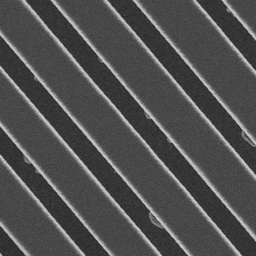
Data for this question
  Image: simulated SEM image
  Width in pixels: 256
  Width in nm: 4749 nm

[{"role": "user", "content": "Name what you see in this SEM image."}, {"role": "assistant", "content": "lines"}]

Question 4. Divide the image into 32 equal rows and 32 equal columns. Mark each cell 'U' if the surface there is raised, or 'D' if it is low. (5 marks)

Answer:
UUUDDDDUUUUUUUDDDUUUUUUUUDDDUUUU
UUUUDDDDUUUUUUUDDDUUUUUUUUDDDUUU
UUUUUDDDDUUUUUUDDDDUUUUUUUUDDDUU
UUUUUUDDDUUUUUUUDDDDUUUUUUUDDDDU
UUUUUUUDDDUUUUUUUDDDUUUUUUUUDDDD
DUUUUUUUDDDUUUUUUUDDDUUUUUUUUDDD
DDUUUUUUUDDDUUUUUUUDDDUUUUUUUUDD
DDDUUUUUUDDDDUUUUUUUDDDUUUUUUUUD
DDDDUUUUUUDDDDUUUUUUUDDDUUUUUUUU
UDDDUUUUUUUDDDUUUUUUUDDDDUUUUUUU
UUDDDUUUUUUUDDDUUUUUUUDDDDUUUUUU
UUUDDDUUUUUUUDDDUUUUUUUDDDUUUUUU
UUUUDDDUUUUUUUDDDUUUUUUUDDDUUUUU
UUUUDDDDUUUUUUUDDDUUUUUUUDDDUUUU
UUUUUDDDDUUUUUUDDDDUUUUUUUDDDUUU
UUUUUUDDDUUUUUUUDDDDUUUUUUDDDDUU
DUUUUUUDDDUUUUUUUDDDUUUUUUUDDDDU
DUUUUUUUDDDUUUUUUUDDDUUUUUUUDDDU
DDUUUUUUUDDDUUUUUUUDDDUUUUUUUDDD
DDDUUUUUUUDDDUUUUUUUDDDUUUUUUUDD
UDDDUUUUUUDDDDUUUUUUDDDDUUUUUUUD
UUDDDUUUUUUDDDDUUUUUUDDDDUUUUUUU
UUUDDDUUUUUUDDDDUUUUUUDDDDUUUUUU
UUUDDDDUUUUUUDDDUUUUUUUDDDUUUUUU
UUUUDDDUUUUUUUDDDUUUUUUUDDDUUUUU
UUUUUDDDUUUUUUUDDDUUUUUUUDDDUUUU
UUUUUUDDDUUUUUUUDDDUUUUUUUDDDUUU
UUUUUUUDDDUUUUUUDDDDUUUUUUDDDDUU
UUUUUUUUDDDUUUUUUDDDDUUUUUUDDDDU
DUUUUUUUUDDDUUUUUUDDDUUUUUUUDDDU
DDUUUUUUUDDDDUUUUUUDDDUUUUUUUDDD
DDDUUUUUUUDDDUUUUUUUDDDUUUUUUUDD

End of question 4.